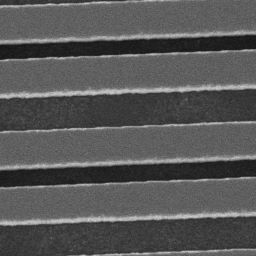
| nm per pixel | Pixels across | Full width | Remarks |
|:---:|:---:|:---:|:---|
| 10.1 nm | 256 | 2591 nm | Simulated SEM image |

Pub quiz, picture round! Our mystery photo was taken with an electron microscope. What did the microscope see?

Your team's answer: lines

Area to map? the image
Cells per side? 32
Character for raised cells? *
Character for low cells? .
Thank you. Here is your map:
......**************************
********************************
********************************
********************************
***************************.....
***.............................
........................********
********************************
********************************
********************************
********************************
********************............
................................
................................
................................
.......................*********
********************************
********************************
********************************
********************************
*******************.............
................................
........................********
********************************
********************************
********************************
********************************
*****************...............
................................
................................
................................
......................**********